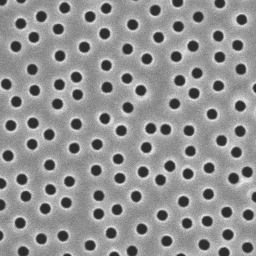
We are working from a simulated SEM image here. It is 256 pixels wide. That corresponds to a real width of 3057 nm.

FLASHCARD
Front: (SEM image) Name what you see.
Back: a regular array of holes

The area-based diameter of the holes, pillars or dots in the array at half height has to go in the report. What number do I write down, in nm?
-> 138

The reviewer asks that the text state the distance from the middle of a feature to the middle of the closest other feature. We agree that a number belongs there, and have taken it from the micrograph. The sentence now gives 251 nm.